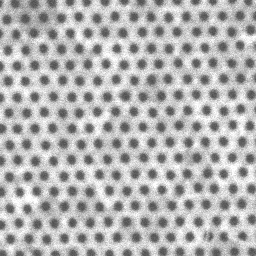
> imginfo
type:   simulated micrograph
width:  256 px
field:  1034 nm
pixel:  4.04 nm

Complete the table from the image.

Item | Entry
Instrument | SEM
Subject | a regular array of holes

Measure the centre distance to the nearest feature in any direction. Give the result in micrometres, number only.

0.0687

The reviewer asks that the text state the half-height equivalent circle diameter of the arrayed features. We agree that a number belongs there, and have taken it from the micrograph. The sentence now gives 0.0403 microns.